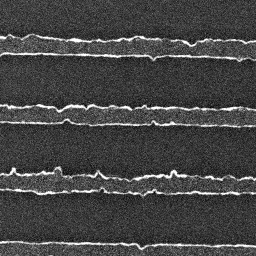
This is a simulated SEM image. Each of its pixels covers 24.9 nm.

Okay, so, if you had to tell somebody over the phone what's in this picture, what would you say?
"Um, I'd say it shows one or a few lines or trenches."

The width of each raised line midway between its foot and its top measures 429 nanometers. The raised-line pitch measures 1700 nanometers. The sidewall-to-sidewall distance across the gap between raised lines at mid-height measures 1.29 um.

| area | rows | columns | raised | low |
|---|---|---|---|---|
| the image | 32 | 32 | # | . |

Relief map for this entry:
................................
................................
................................
................................
...##...........................
################################
################################
................................
................................
................................
................................
................................
................................
#######.########.#...##.#....##.
################################
.........####..####.#.##########
................................
................................
................................
................................
................................
.#....##........................
################################
################################
................................
................................
................................
................................
................................
................................
#########.##..##................
################################